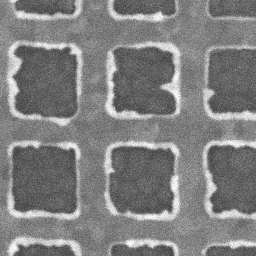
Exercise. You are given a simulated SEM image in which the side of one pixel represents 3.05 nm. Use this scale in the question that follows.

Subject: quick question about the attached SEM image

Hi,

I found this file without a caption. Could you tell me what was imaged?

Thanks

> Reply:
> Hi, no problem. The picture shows holes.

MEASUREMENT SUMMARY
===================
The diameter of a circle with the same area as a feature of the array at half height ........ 0.219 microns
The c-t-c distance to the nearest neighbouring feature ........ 297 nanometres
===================